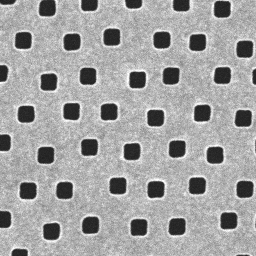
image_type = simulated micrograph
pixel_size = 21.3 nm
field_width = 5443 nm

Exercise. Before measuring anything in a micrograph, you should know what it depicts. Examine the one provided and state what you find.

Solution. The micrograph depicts a regular array of holes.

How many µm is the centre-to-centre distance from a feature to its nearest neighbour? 0.799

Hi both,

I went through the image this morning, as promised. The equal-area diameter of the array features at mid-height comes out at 0.4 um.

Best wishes